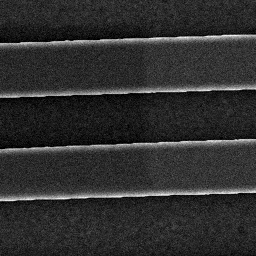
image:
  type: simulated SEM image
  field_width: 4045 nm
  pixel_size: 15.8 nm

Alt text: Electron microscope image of lines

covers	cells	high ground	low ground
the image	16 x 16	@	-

----------------
----------------
------@@@@@@@@@@
@@@@@@@@@@@@@@@@
@@@@@@@@@@@@@@@@
@@@@@@@@@@@@@@@@
----------------
----------------
----------------
@@@@@@@@@@@@@@@@
@@@@@@@@@@@@@@@@
@@@@@@@@@@@@@@@@
@---------------
----------------
----------------
----------------